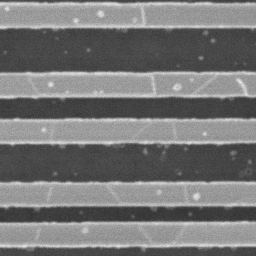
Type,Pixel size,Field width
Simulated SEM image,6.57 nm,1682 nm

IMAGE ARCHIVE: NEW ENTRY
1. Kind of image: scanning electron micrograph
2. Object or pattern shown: lines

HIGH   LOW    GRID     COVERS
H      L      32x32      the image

HHHHHLLHHHHHHHHLLLHHHHHLLHLLLLLL
HHHHHHHHHHHHHHHHHHHHHHHHHHHHHHHH
HHHHHHHHHHHHHHHHHHHHHHHHHHHHHHHH
HLLLLLLLLLLLLLLLLLLLLLLLLLLLLLLL
LLLLLLLLLLLLLLLLLLLLLLLLLLLLLLLL
LLLLLLLLLLLLLLLLLLLLLLLLLLLLLLLL
LLLLLLLLLLLLLLLLLLLLLLLLLLLLLLLL
LLLLLLLLLLLLLLLLLLLLLLLLLLLLLLLL
LLLLLLLLLLLLLLLLLLLLLLLLLLLLLLLL
HHHHHHHHHHHHHHHHHHHHHHHHHHHHHHHH
HHHHHHHHHHHHHHHHHHHHHHHHHHHHHHHH
HHHHHHHHHHHHHHHHHHHHHHHHHHHHHHHH
LLLLLLLLLLLLLLLLLLLLLLLLLLLLLLLL
LLLLLLLLLLLLLLLLLLLLLLLLLLLLLLLL
LLLLLLLLLLLLLLLLLLLLLLLLLLLLLLLL
HHHHHHHHHHHHHHHHHHHHHHHHHHHHHHHH
HHHHHHHHHHHHHHHHHHHHHHHHHHHHHHHH
HHHHHHHHHHHHHHHHHHHHHHHHHHHHHHHH
LLLLLLLLLLLLLLLLLLLLLLLLLLLLLLLL
LLLLLLLLLLLLLLLLLLLLLLLLLLLLLLLL
LLLLLLLLLLLLLLLLLLLLLLLLLLLLLLLL
LLLLLLLLLLLLLLLLLLLLLLLLLLLLLLLL
LLLLLLLLLLLLLLLLLLLLLLLLLLLLLLLL
HHHHHHHHHHHHHHHHHHHHHHHHHHHHHHHH
HHHHHHHHHHHHHHHHHHHHHHHHHHHHHHHH
HHHHHHHHHHHHHHHHHHHHHHHHHHHHHHHH
LLLLLLLLLLLLLLLLLLLLLLLLLLLLLLLL
LLLLLLLLLLLLLLLLLLLLLLLLLLLLLLLL
HHHHHHHHHHHHHHHHHHHHHHHHHHHHHHHH
HHHHHHHHHHHHHHHHHHHHHHHHHHHHHHHH
HHHHHHHHHHHHHHHHHHHHHHHHHHHHHHHH
LLLLLLLLLLLLLLLLLLLLLLLLLLLLLLLL